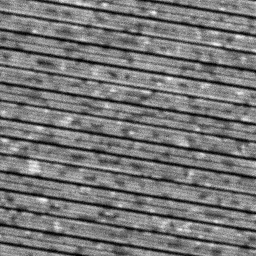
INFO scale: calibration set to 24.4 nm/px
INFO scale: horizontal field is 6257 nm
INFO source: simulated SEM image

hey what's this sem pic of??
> parallel lines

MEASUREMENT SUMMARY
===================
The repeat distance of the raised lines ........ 0.214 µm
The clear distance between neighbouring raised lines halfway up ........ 87.5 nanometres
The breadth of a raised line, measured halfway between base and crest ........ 151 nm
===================